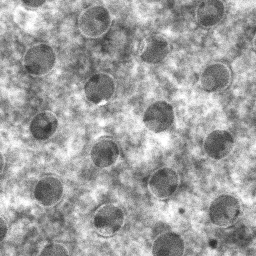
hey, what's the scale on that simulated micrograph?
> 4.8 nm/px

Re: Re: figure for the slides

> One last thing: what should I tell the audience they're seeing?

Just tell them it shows a regular array of raised bodies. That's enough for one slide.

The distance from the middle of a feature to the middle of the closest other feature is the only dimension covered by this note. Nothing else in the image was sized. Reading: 316 nanometers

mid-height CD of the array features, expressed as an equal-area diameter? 0.152 microns